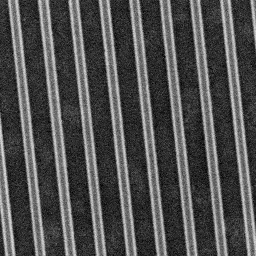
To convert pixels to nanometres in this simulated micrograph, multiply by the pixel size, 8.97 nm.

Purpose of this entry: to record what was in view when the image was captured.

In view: parallel lines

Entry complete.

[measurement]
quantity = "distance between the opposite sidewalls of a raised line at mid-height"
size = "77 nanometers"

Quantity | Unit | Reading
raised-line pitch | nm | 270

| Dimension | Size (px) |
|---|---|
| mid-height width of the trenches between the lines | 21.4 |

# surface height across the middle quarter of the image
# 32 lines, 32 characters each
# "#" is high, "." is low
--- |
...##......##.....##......##....
...##......##......##.....##....
...##......##......##.....##....
...##......##......##.....##....
....##.....##......##.....##....
....##.....##......##......#....
....##.....###.....##......##...
....##.....###.....##......##...
....##......##.....##......##...
....##......##.....##......##...
....##......##......#......##...
....##......##......##.....##...
....##......##......##.....##...
.....##.....##......##.....##...
.....##.....##......##.....##...
.....##.....###.....##......##..
.....##.....###.....##......##..
.....##......##.....##......##..
.....##......##.....##......##..
.....##......##.....##......##..
.....##......##......##.....##..
.....##......##......##.....##..
......##.....##......##.....##..
......##.....##......##.....##..
......##.....##......##......##.
......##.....###.....##......##.
......##.....###.....##......##.
#.....##......##.....##......##.
#.....##......##.....##......##.
#.....##......##......##.....##.
#.....##......##......##.....##.
#.....##......##......##.....##.